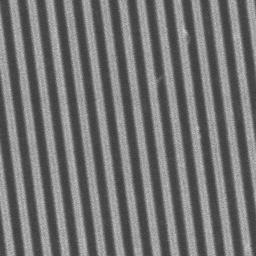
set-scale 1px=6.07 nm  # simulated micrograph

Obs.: parallel lines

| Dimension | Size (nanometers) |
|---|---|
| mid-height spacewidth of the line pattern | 61.7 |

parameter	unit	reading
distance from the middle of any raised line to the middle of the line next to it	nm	110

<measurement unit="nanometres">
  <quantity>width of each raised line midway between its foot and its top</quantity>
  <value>50.3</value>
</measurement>